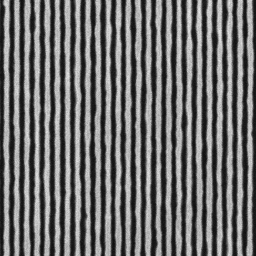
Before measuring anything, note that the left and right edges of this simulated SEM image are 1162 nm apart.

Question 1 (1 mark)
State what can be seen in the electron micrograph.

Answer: parallel lines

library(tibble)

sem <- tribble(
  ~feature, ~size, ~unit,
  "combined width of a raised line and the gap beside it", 46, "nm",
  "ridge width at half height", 23.2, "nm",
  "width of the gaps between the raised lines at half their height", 23.2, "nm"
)